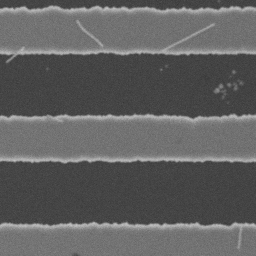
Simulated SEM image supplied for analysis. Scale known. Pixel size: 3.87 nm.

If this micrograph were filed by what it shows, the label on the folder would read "lines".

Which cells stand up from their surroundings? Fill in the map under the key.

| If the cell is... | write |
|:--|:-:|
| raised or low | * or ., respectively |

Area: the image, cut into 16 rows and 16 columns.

...*..**......**
****************
****************
................
................
................
................
****************
****************
****************
................
................
................
................
****************
****************